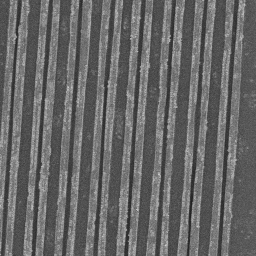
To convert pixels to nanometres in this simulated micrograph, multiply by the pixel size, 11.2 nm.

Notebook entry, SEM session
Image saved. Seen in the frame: parallel lines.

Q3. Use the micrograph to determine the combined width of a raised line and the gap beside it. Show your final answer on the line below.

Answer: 171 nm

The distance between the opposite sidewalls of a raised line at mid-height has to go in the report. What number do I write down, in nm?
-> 76.9